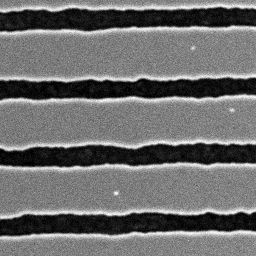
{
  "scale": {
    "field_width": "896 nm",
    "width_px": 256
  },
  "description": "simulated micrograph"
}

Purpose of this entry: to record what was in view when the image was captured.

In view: lines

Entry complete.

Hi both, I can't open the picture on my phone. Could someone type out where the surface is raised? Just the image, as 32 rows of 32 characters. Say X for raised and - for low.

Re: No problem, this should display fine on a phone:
XXXXXXXXXXXXXXXXXXXXXXXXXXXXXXXX
X-------------------------------
--------------------------------
----------------X-XXXX-XXX--XXXX
XXXXXXXXXXXXXXXXXXXXXXXXXXXXXXXX
XXXXXXXXXXXXXXXXXXXXXXXXXXXXXXXX
XXXXXXXXXXXXXXXXXXXXXXXXXXXXXXXX
XXXXXXXXXXXXXXXXXXXXXXXXXXXXXXXX
XXXXXXXXXXXXXXXXXXXXXXXXXXXXXXXX
XXXXXXXXXXXXXXXXXXXXXXXXXXXXXXXX
--------------------------------
--------------------------------
XXXX-XXXXXXXXXXXXXXXXXXXXXXXXXXX
XXXXXXXXXXXXXXXXXXXXXXXXXXXXXXXX
XXXXXXXXXXXXXXXXXXXXXXXXXXXXXXXX
XXXXXXXXXXXXXXXXXXXXXXXXXXXXXXXX
XXXXXXXXXXXXXXXXXXXXXXXXXXXXXXXX
XXXXXXXXXXXXXXXXXXXXXXXXXXXXXXXX
XXXX------------X---------------
--------------------------------
--------------------XXXXX--XXXXX
XXXXXXXXXXXXXXXXXXXXXXXXXXXXXXXX
XXXXXXXXXXXXXXXXXXXXXXXXXXXXXXXX
XXXXXXXXXXXXXXXXXXXXXXXXXXXXXXXX
XXXXXXXXXXXXXXXXXXXXXXXXXXXXXXXX
XXXXXXXXXXXXXXXXXXXXXXXXXXXXXXXX
XXXXXXXXXXXXXXXXXX-XXXXXXXXXXXXX
--------------------------------
--------------------------------
---XXXXXXXXXXXXXXXXXXXXXXXXXXXXX
XXXXXXXXXXXXXXXXXXXXXXXXXXXXXXXX
XXXXXXXXXXXXXXXXXXXXXXXXXXXXXXXX